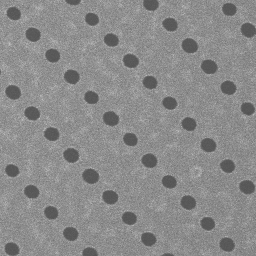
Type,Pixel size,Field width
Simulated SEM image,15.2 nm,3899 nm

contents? a regular array of holes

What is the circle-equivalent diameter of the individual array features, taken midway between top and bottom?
229 nm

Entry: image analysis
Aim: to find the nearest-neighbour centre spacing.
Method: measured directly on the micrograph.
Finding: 434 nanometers